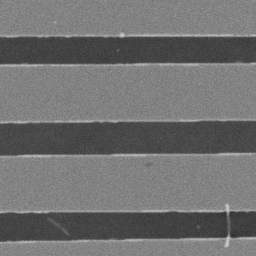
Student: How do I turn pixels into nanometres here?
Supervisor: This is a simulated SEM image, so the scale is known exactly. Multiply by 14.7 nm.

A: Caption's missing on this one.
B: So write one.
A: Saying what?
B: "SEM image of lines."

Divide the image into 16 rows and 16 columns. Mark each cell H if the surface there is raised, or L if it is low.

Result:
HHHHHHHHHHHHHHHH
HHHHHHHHHHHHHHHH
LLLLLLLLLLLLLLLL
LLLLLLLLLLLLLLLL
HHHHHHHHHHHHHHHH
HHHHHHHHHHHHHHHH
HHHHHHHHHHHHHHHH
HHHHHHHHHHHHHHHH
LLLLLLLLLLLLLLLL
LLLLLLLLLLLLLLLL
HHHHHHHHHHHHHHHH
HHHHHHHHHHHHHHHH
HHHHHHHHHHHHHHHH
LLLLLLLLLLLLLLLL
LLLLLLLLLLLLLLLL
HHHHHHHHHHHHHHHH